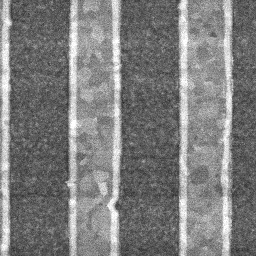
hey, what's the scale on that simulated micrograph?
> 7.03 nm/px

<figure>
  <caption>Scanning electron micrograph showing one or a few lines or trenches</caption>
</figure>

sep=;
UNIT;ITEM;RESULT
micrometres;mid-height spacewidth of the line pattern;0.474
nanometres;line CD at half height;304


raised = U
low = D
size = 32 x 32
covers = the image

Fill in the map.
UDDDDDDDDUUUUUDDDDDDDDDUUUUUDDDD
UDDDDDDDDUUUUUDDDDDDDDDUUUUUDDDD
UDDDDDDDDUUUUUDDDDDDDDDUUUUUDDDD
UDDDDDDDDUUUUUDDDDDDDDDUUUUUDDDD
UDDDDDDDDUUUUUUDDDDDDDDUUUUUDDDD
UDDDDDDDDUUUUUUDDDDDDDDUUUUUDDDD
UDDDDDDDDUUUUUUDDDDDDDDUUUUUDDDD
UDDDDDDDDUUUUUUDDDDDDDDUUUUUDDDD
UDDDDDDDDUUUUUUDDDDDDDDUUUUUUDDD
UDDDDDDDDUUUUUUDDDDDDDDUUUUUUDDD
UDDDDDDDDUUUUUUDDDDDDDDUUUUUUDDD
UDDDDDDDDUUUUUUDDDDDDDDUUUUUUDDD
UDDDDDDDDUUUUUUDDDDDDDDUUUUUUDDD
UDDDDDDDDUUUUUUDDDDDDDDUUUUUUDDD
UDDDDDDDDUUUUUUDDDDDDDDUUUUUUDDD
UDDDDDDDDUUUUUUDDDDDDDDUUUUUUDDD
UDDDDDDDDUUUUUUDDDDDDDDUUUUUDDDD
UDDDDDDDDUUUUUUDDDDDDDDUUUUUDDDD
UDDDDDDDDUUUUUUDDDDDDDDUUUUUDDDD
UDDDDDDDDUUUUUUDDDDDDDDUUUUUDDDD
UDDDDDDDDUUUUUUDDDDDDDDUUUUUDDDD
UDDDDDDDDUUUUUUDDDDDDDDUUUUUDDDD
UDDDDDDDDUUUUUUDDDDDDDDUUUUUDDDD
UDDDDDDDDUUUUUUDDDDDDDDUUUUUDDDD
UDDDDDDDDUUUUUDDDDDDDDDUUUUUDDDD
UDDDDDDDDUUUUUDDDDDDDDDUUUUUDDDD
UDDDDDDDDUUUUUDDDDDDDDDUUUUUDDDD
UDDDDDDDDUUUUUDDDDDDDDDUUUUUDDDD
UDDDDDDDDUUUUUDDDDDDDDDUUUUUDDDD
UDDDDDDDDUUUUUDDDDDDDDDUUUUUDDDD
UDDDDDDDDUUUUUDDDDDDDDDUUUUUDDDD
UDDDDDDDDUUUUUDDDDDDDDDUUUUUDDDD